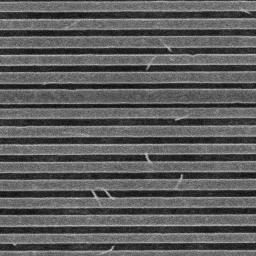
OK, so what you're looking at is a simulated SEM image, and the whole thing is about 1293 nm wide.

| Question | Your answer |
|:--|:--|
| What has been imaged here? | parallel lines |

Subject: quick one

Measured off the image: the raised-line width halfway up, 53.6 nm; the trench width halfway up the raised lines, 36 nanometers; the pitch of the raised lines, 90.1 nm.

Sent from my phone